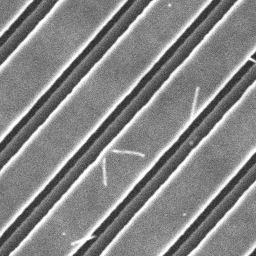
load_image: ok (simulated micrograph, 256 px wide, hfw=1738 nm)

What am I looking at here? lines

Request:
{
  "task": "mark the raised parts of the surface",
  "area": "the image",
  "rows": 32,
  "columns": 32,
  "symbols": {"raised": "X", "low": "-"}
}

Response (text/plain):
XXXX---XXXXXXXX----XXXXXXX---XXX
XXX---XXXXXXXXX---XXXXXXX---XXXX
XX---XXXXXXXXX---XXXXXXX----XXXX
X---XXXXXXXXX---XXXXXXX----XXXXX
----XXXXXXXX---XXXXXXX----XXXXXX
---XXXXXXXX---XXXXXXXX---XXXXXXX
--XXXXXXXX---XXXXXXXX---XXXXXXXX
-XXXXXXXX----XXXXXXX---XXXXXXXX-
XXXXXXXX----XXXXXXX---XXXXXXXX--
XXXXXXX----XXXXXXX---XXXXXXXX---
XXXXXXX---XXXXXXX---XXXXXXXX----
XXXXXX---XXXXXXX----XXXXXXX----X
XXXXX---XXXXXXX----XXXXXXX----XX
XXXX---XXXXXXX----XXXXXXXX---XXX
XXX---XXXXXXXX---XXXXXXXX---XXXX
XX---XXXXXXXX---XXXXXXXX---XXXXX
X---XXXXXXXX---XXXXXXXX---XXXXXX
----XXXXXXX---XXXXXXXX---XXXXXXX
---XXXXXXX---XXXXXXXX---XXXXXXXX
--XXXXXXX---XXXXXXXX----XXXXXXX-
-XXXXXXX---XXXXXXXX----XXXXXXXX-
XXXXXXX---XXXXXXXX----XXXXXXXX--
XXXXXX----XXXXXXX----XXXXXXXX---
XXXXX----XXXXXXXX---XXXXXXXX---X
XXXXX---XXXXXXXX---XXXXXXXX---XX
XXXX---XXXXXXXX---XXXXXXXX----XX
XXX---XXXXXXXX---XXXXXXXX---XXXX
XX---XXXXXXXX---XXXXXXXX----XXXX
X---XXXXXXXX---XXXXXXXX----XXXXX
---XXXXXXXX----XXXXXXXX---XXXXXX
---XXXXXXX----XXXXXXXX---XXXXXXX
--XXXXXXX----XXXXXXXX---XXXXXXX-